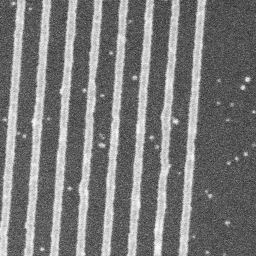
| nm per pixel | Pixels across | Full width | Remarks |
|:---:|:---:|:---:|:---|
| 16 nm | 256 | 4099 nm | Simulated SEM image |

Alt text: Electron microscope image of parallel lines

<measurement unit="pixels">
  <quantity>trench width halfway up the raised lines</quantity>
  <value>19.3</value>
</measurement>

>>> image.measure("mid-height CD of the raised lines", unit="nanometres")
102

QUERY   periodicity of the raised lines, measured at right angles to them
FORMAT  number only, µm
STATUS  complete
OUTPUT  0.412